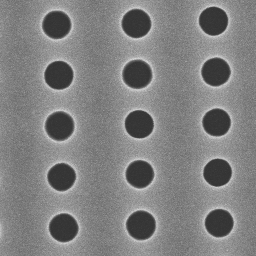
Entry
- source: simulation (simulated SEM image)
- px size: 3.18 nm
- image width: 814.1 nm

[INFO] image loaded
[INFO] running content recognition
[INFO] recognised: a regular array of holes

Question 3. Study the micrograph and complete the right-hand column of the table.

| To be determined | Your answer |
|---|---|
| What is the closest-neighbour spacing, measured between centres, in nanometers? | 160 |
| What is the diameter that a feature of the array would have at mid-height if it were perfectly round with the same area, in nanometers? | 88.5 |